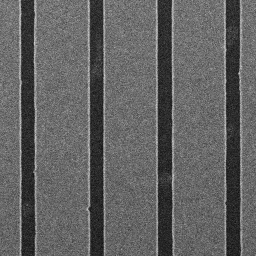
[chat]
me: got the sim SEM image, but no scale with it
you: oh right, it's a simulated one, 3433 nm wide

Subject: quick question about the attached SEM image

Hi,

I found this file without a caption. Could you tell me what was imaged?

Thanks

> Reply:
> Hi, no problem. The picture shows one or a few lines or trenches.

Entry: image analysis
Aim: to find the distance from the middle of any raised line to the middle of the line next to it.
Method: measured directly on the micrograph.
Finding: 916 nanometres